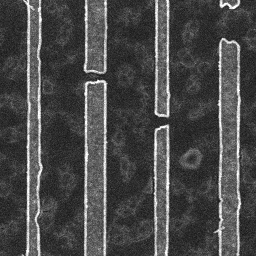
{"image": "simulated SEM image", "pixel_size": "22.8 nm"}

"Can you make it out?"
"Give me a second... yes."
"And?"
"one or a few lines or trenches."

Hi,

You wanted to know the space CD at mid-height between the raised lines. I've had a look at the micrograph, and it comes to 1130 nanometres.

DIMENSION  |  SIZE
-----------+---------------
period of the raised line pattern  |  1480 nm